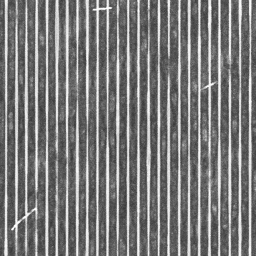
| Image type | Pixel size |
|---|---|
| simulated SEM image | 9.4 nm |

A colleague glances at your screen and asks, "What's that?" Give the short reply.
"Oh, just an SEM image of parallel lines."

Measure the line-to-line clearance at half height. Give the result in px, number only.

8.37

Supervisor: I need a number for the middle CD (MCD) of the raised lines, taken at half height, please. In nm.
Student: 15.3